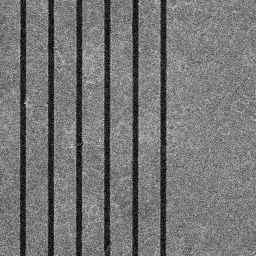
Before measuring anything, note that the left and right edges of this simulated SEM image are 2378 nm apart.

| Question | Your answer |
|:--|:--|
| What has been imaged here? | parallel lines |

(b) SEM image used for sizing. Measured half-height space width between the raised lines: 63.8 nanometres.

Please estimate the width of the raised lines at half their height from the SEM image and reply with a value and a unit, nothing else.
200 nm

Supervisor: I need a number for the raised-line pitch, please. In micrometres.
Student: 0.261